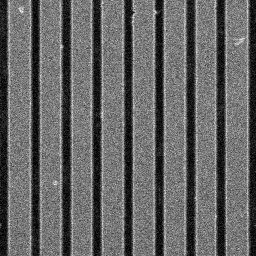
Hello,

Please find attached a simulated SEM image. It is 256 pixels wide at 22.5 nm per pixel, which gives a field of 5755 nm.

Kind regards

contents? parallel lines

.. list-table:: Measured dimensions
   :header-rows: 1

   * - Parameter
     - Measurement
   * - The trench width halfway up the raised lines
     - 214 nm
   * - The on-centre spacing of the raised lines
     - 699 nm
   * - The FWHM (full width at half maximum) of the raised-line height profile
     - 489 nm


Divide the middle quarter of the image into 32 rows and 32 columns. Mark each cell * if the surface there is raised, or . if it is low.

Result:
..*****...*****..******..*****..
..*****...*****..******..*****..
..*****...*****..******..*****..
..*****...*****..******..*****..
..*****...*****..******..*****..
..*****...*****..******..*****..
..*****...*****..******..*****..
..*****...*****..******..*****..
..*****...*****..******..*****..
..*****...*****..******..*****..
..*****...*****..******..*****..
..*****...*****..******..*****..
..*****..******..******..*****..
..*****..******..******..*****..
..*****...*****..******..*****..
..*****...*****..******..*****..
..*****...*****..******..*****..
..*****...*****..******..*****..
..*****...*****..******..*****..
..*****...*****..******..*****..
..*****...*****..******..*****..
..*****...*****..******..*****..
..*****...*****..******..*****..
..*****...*****..******..*****..
..*****...*****..******..*****..
..*****...*****..******..*****..
..*****...*****..******..*****..
..*****...*****..******..*****..
..*****...*****..******..*****..
..*****...*****..******..*****..
..*****...*****..******..*****..
..*****...*****..******..*****..